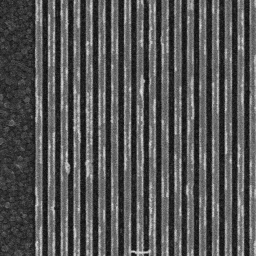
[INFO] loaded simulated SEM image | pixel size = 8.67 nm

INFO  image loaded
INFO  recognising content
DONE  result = parallel lines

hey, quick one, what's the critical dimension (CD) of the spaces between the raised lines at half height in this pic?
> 50.9 nanometers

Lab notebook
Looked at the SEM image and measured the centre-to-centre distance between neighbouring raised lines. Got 110 nm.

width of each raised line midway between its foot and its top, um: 0.0596